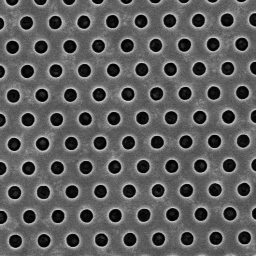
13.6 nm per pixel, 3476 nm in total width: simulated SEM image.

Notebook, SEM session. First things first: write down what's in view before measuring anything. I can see a regular array of holes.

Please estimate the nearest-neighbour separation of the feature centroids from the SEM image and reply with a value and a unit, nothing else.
378 nanometres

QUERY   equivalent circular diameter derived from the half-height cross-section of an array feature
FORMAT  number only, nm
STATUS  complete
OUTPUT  179